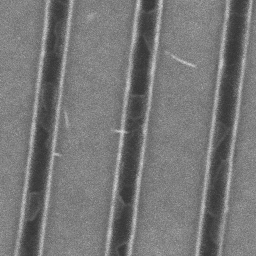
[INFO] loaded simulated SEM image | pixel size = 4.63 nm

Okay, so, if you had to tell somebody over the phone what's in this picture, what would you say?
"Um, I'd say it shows one or a few lines or trenches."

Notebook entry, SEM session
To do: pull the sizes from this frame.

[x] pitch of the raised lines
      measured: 413 nanometers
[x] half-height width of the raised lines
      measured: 116 nm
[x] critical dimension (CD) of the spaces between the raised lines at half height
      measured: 295 nm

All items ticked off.